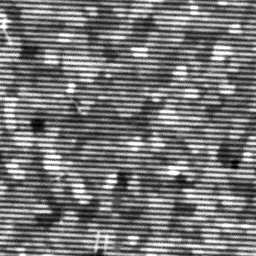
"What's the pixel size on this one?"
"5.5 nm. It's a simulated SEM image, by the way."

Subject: parallel lines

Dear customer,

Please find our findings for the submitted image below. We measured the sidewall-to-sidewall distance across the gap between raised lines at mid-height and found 21.3 nm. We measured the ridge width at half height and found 7.6 nanometres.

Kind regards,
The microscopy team